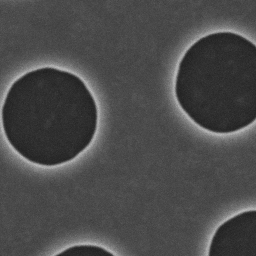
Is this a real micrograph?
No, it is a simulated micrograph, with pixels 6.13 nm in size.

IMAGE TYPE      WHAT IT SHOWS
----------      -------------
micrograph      holes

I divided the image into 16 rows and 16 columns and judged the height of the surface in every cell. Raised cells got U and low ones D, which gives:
UUUUUUUUUUUUUUUU
UUUUUUUUUUUUUUUU
UUUUUUUUUUUUDDDU
UUUUUUUUUUUDDDDD
UUDDUUUUUUUDDDDD
UDDDDUUUUUUDDDDD
DDDDDDUUUUUDDDDD
DDDDDDUUUUUUDDDD
DDDDDDUUUUUUUUUU
UDDDDUUUUUUUUUUU
UUUUUUUUUUUUUUUU
UUUUUUUUUUUUUUUU
UUUUUUUUUUUUUUUU
UUUUUUUUUUUUUUUD
UUUUUUUUUUUUUDDD
UUUUDDUUUUUUUDDD